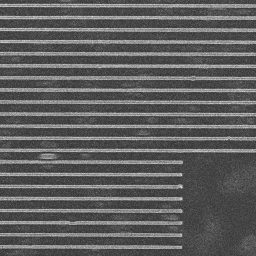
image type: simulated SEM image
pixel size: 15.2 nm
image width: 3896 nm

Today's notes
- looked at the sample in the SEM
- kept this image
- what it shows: parallel lines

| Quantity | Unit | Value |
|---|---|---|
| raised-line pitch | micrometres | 0.184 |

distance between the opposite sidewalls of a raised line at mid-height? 38.1 nm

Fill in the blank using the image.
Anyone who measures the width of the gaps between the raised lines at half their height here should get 152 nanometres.